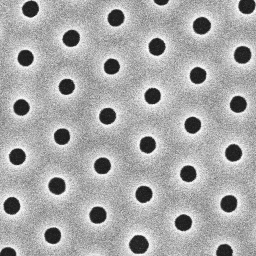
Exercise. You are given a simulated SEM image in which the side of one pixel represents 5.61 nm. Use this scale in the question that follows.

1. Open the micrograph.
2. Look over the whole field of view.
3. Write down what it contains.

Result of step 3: a regular array of holes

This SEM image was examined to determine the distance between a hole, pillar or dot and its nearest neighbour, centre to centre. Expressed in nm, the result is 276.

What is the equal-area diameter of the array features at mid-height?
0.0969 micrometres